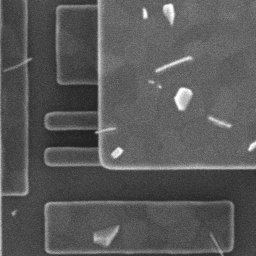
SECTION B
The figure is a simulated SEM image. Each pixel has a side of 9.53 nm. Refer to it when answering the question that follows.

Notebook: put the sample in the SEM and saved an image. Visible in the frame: wiring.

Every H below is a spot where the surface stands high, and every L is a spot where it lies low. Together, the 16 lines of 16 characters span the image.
LLLLLLHHHHHHHHHH
LLLLLLHHHHHHHHHH
LLLLLLHHHHHHHHHH
LLLLLLHHHHHHHHHH
LLLLLLHHHHHHHHHH
LLLLLLHHHHHHHHHH
LLLLLLHHHHHHHHHH
LLLLLLHHHHHHHHHH
LLLLLLHHHHHHHHHH
LLLLLLHHHHHHHHHH
LLLLLLLHHHHHHHHH
LLLLLLLLLLLLLLLL
LLLLLLLLLLLLLLLL
LLLLLLLLLLLLLLLL
LLLLLLLLLLLLLLLL
LLLLLLLLLLLLLLLL